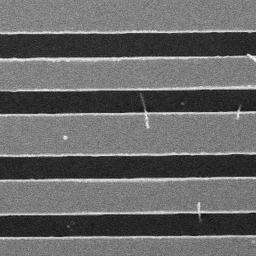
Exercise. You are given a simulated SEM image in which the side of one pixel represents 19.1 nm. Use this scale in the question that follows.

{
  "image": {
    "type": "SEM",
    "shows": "lines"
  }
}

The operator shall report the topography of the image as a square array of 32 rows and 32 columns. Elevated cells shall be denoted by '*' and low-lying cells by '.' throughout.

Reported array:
********************************
********************************
********************************
********************************
................................
................................
................................
********************************
********************************
********************************
********************************
................................
................................
................................
********************************
********************************
********************************
********************************
********************************
********........................
................................
................................
...**.**************************
********************************
********************************
********************************
********************************
................................
................................
...........................*****
********************************
********************************